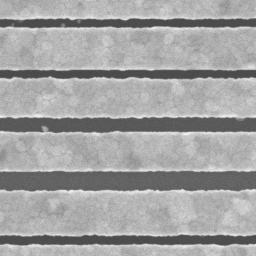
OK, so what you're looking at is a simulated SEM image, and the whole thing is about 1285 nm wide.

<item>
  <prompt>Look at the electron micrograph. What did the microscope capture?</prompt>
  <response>lines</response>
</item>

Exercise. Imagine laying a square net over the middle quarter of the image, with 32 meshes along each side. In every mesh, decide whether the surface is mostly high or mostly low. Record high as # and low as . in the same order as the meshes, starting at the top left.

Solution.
################################
................................
................................
..#....####.....##..#...........
################################
################################
################################
################################
################################
################################
################################
################################
################################
................................
................................
................................
................................
################################
################################
################################
################################
################################
################################
################################
################################
################################
################################
................................
................................
................................
................................
.....................#.......#..